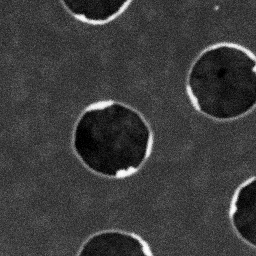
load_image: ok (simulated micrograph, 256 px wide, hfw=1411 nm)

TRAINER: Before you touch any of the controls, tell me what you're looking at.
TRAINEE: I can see holes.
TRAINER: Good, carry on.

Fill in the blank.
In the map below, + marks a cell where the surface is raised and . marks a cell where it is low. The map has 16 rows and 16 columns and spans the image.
++++....++++++++
++++++++++++++++
++++++++++++++++
+++++++++++++...
++++++++++++....
++++++++++++....
++++++++++++....
+++++....+++++++
+++++....+++++++
+++++....+++++++
++++++..++++++++
+++++++++++++++.
+++++++++++++++.
+++++++++++++++.
+++++++++++++++.
+++++....+++++++